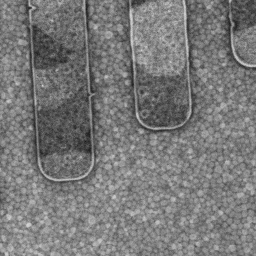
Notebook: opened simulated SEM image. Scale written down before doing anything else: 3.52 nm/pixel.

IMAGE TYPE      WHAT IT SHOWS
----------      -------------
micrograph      one or a few lines or trenches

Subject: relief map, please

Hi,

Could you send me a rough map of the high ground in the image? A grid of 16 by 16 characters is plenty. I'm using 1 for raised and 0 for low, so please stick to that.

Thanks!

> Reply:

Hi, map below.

0011100011110011
0011100011110011
0011100011110011
0011100011110001
0011110011110000
0011110011110000
0011110011110000
0011110001110000
0011110000000000
0011110000000000
0001110000000000
0000000000000000
0000000000000000
0000000000000000
0000000000000000
0000000000000000